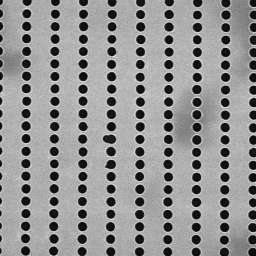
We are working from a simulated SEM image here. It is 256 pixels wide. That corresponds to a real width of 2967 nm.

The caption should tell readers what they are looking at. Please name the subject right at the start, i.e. a regular array of holes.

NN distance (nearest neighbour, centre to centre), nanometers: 141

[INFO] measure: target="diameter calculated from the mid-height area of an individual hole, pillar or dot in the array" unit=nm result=106